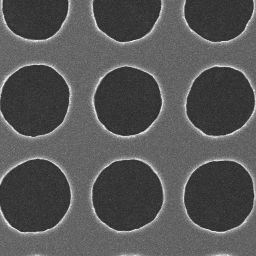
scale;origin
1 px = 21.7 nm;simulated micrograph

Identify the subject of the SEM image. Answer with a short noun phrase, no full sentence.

holes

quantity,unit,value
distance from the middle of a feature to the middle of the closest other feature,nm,2010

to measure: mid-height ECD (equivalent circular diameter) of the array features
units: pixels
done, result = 70.2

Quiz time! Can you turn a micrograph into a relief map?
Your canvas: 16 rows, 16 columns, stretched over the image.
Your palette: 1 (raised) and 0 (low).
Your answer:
0000110000110000
0000110000110001
1111111011111011
1111111111111111
1000111001111001
0000110000110000
0000110000110000
0000110000110001
1111111111111011
1111111111111111
1000111001110001
0000110000110000
0000110000110000
0000110000110001
1111111111111111
1111111111111111